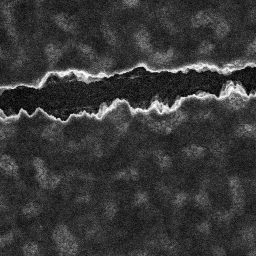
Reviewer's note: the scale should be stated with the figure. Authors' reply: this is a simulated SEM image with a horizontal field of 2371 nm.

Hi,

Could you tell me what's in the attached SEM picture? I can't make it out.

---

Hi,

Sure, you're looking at one or a few lines or trenches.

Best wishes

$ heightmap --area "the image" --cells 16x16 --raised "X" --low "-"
XXXXXXXXXXXXXXXX
XXXXXXXXXXXXXXXX
XXXXXXXXXXXXXXXX
XXXXXXXXXXXXXXXX
XXXXXXXX--------
----------------
-------X---XXXXX
XXXXXXXXXXXXXXXX
XXXXXXXXXXXXXXXX
XXXXXXXXXXXXXXXX
XXXXXXXXXXXXXXXX
XXXXXXXXXXXXXXXX
XXXXXXXXXXXXXXXX
XXXXXXXXXXXXXXXX
XXXXXXXXXXXXXXXX
XXXXXXXXXXXXXXXX